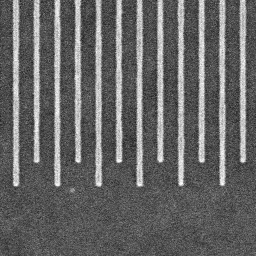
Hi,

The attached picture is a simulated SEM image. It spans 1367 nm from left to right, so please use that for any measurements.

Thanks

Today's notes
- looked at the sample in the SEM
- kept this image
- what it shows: parallel lines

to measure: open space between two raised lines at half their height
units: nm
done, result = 88.1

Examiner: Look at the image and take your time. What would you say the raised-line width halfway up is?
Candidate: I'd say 0.0227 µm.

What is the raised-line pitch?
0.11 um